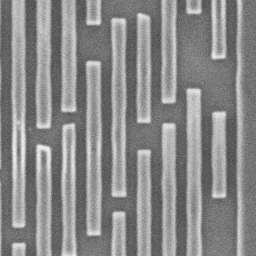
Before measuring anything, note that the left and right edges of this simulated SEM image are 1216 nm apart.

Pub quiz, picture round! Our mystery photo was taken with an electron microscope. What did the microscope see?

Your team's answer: wiring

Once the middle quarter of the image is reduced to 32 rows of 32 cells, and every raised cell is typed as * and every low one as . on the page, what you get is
***...***...***...***....***....
***...***...***....**....***....
***...***...***....**....***....
***...***...***....**....***....
***...***...***....**....***....
***...***...***....**....***....
***...***...***....**....***...*
***...***...***...***....***...*
***...***...***...***....***...*
***...***...***...***....**....*
***...***...***....**..........*
***...***...***....**..........*
......***...***....**..........*
......***...***....**..........*
......***...***................*
***...***...***..........***...*
***...***...***..........***...*
***...***...***..........***...*
***...***...***..........***...*
***...***...***..........***...*
***...***...***..........***...*
***...***...***..........***...*
***...***...***....**....***...*
***...***...***....**....***...*
***...***...***....**....***...*
***...***...***....**....***...*
***...***...***....**....***...*
***...***...***....**....***...*
***...***...***....**....***...*
***...***...***....**....***...*
***...***...***....**....***...*
***...***...***....**....***...*